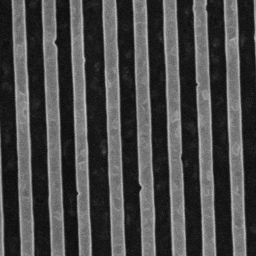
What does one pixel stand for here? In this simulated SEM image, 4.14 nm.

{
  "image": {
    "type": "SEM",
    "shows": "parallel lines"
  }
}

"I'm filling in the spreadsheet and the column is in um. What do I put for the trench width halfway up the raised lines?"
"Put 0.072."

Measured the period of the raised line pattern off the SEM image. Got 126 nm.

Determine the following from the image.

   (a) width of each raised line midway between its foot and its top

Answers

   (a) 53.8 nm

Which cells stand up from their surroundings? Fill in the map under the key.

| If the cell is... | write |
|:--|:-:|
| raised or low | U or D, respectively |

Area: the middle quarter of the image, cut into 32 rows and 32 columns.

DDUUUDDDDDUUUDDDDDUUUDDDDDUUUDDD
DDUUUDDDDDUUUDDDDDUUUDDDDDUUDDDD
DDUUUDDDDDUUUUDDDDUUUDDDDDUUDDDD
DDUUUDDDDDDUUUDDDDUUUDDDDDUUUDDD
DDDUUDDDDDDUUUDDDDUUUDDDDDUUUDDD
DDDUUDDDDDDUUUDDDDUUUDDDDDUUUDDD
DDDUUDDDDDDUUUDDDDUUUDDDDDUUUDDD
DDDUUDDDDDDUUUDDDDUUUDDDDDUUUDDD
DDDUUDDDDDDUUUDDDDUUUDDDDDUUUDDD
DDDUUDDDDDDUUUDDDDUUUDDDDDUUUDDD
DDDUUDDDDDDUUUDDDDUUUDDDDDUUUDDD
DDDUUDDDDDDUUUDDDDUUUDDDDDUUUDDD
DDDUUDDDDDDUUUDDDDUUUDDDDDUUUDDD
DDDUUDDDDDDUUUDDDDUUUUDDDDUUUDDD
DDDUUDDDDDDUUUDDDDDUUUDDDDUUUDDD
DDDUUUDDDDDUUUDDDDDUUUDDDDUUUDDD
DDDUUUDDDDDUUUDDDDDUUUDDDDUUUDDD
DDDUUUDDDDDUUUDDDDDUUUDDDDUUUDDD
DDDUUUDDDDDUUUDDDDDUUUDDDDUUUDDD
DDDUUUDDDDDUUUDDDDDUUUDDDDUUUDDD
DDDUUUDDDDDUUUDDDDDUUUDDDDUUUDDD
DDDUUUDDDDDUUUDDDDDUUUDDDDUUUDDD
DDDUUUDDDDDUUUDDDDDUUUDDDDUUUDDD
DDDUUUDDDDDUUUDDDDDUUUDDDDUUUDDD
DDDUUUDDDDDUUUDDDDDUUUDDDDUUUUDD
DDDUUUDDDDDUUUDDDDDUUUDDDDDUUUDD
DDDUUUDDDDDUUUDDDDDUUUDDDDDUUUDD
DDDUUUDDDDDUUUDDDDDUUUDDDDDUUUDD
DDDUUUDDDDDUUUDDDDDUUUDDDDDUUUDD
DDDUUUDDDDDUUUUDDDDUUUDDDDDUUUDD
DDDUUUDDDDDDUUUDDDDUUUDDDDDUUUDD
DDDUUUDDDDDDUUUDDDDUUUDDDDDUUUDD